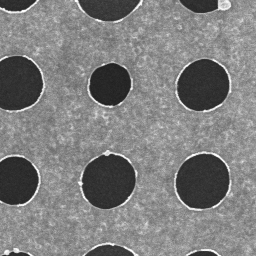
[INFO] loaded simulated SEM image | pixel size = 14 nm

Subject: holes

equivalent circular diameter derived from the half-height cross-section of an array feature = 746 nanometres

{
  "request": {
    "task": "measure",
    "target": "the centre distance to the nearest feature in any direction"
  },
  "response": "93.7 px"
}